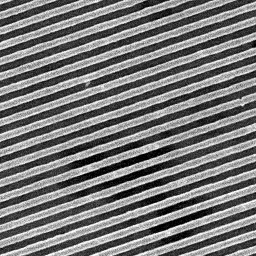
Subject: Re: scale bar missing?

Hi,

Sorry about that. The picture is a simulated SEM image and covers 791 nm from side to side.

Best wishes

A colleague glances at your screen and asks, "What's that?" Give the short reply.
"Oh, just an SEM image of parallel lines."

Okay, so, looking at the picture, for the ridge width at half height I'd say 20.8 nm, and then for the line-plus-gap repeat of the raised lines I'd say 14.4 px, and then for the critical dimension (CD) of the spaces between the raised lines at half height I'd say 23.7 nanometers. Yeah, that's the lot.